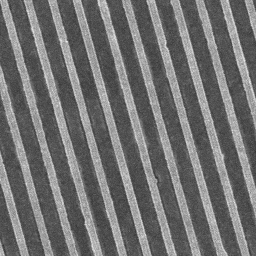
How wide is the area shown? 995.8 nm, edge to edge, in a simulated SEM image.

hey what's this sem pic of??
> parallel lines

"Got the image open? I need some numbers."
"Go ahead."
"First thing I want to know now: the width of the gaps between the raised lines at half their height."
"63.3 nm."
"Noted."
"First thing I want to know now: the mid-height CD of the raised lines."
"28.1 nanometres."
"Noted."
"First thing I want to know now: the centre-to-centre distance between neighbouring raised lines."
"92 nm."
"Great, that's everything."